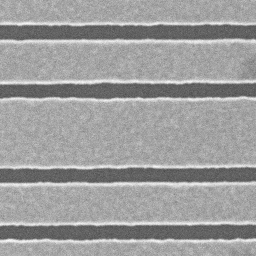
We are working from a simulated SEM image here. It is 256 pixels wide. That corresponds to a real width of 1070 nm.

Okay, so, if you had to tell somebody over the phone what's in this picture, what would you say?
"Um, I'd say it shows lines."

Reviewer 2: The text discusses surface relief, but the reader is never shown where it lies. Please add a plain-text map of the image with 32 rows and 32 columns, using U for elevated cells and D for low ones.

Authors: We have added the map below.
UUUUUUUUUUUUUUUUUUUUUUUUUUUUUUUU
UUUUUUUUUUUUUUUUUUUUUUUUUUUUUUUU
UUUUUUUUUUUUUUUUUUUUUUUUUUUUUUUU
DDDDDDDDDDDDDDDDDDDDDDDDDDDDDDDD
DDDDDDDDDDDDDDDDDDDDDDDDDDDDDDDD
UUUUUUUUUUUUUUUUUUUUUUUUUUUUUUUU
UUUUUUUUUUUUUUUUUUUUUUUUUUUUUUUU
UUUUUUUUUUUUUUUUUUUUUUUUUUUUUUUU
UUUUUUUUUUUUUUUUUUUUUUUUUUUUUUUU
UUUUUUUUUUUUUUUUUUUUUUUUUUUUUUUU
DDDDDDDDDDDDDDDDDDDDDDDDDDDDDDDD
DDDDDDDDDDDDDDDDDDDDDDDDDDDDDDDD
UUUUUUUUUUUUUUUUUUUUUUUUUUUUUUUU
UUUUUUUUUUUUUUUUUUUUUUUUUUUUUUUU
UUUUUUUUUUUUUUUUUUUUUUUUUUUUUUUU
UUUUUUUUUUUUUUUUUUUUUUUUUUUUUUUU
UUUUUUUUUUUUUUUUUUUUUUUUUUUUUUUU
UUUUUUUUUUUUUUUUUUUUUUUUUUUUUUUU
UUUUUUUUUUUUUUUUUUUUUUUUUUUUUUUU
UUUUUUUUUUUUUUUUUUUUUUUUUUUUUUUU
UUUUUUUUUUUUUUUUUUUUUUUUUUUUUUUU
DDDDDDDDDDDDDDDDDDDDDDDDDDDDDDDD
DDDDDDDDDDDDDDDDDDDDDDDDDDDDDDDD
UUUUUUUUUUUUUUUUUUUUUUUUUUUUUUUU
UUUUUUUUUUUUUUUUUUUUUUUUUUUUUUUU
UUUUUUUUUUUUUUUUUUUUUUUUUUUUUUUU
UUUUUUUUUUUUUUUUUUUUUUUUUUUUUUUU
UUUUUUUUUUUUUUUUUUUUUUUUUUUUUUUU
DDDDDDDDDDDDDDDDDDDDDDDDDDDDDDDD
DDDDDDDDDDDDDDDDDDDDDDDDDDDDDDDD
UUUUUUUUUUUUUUUUUUUUUUUUUUUUUUUU
UUUUUUUUUUUUUUUUUUUUUUUUUUUUUUUU